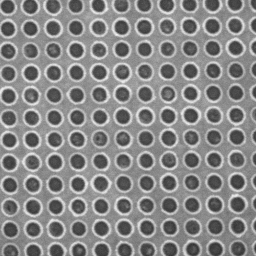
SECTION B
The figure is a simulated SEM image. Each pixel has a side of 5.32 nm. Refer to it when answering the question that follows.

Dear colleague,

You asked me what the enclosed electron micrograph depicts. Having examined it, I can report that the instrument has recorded a regular array of holes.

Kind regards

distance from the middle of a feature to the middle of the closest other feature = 118 nm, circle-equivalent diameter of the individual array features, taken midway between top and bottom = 16.1 pixels